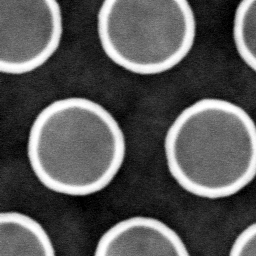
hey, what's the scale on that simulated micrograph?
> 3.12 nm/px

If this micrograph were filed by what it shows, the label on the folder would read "raised bodies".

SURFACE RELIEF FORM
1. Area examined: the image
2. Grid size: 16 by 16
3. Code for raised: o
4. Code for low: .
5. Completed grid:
ooo....ooooo...o
oooo..oooooo...o
ooo...oooooo...o
ooo....oooo....o
................
................
....oo.......o..
..ooooo....oooo.
..ooooo....ooooo
..oooooo...ooooo
..ooooo....ooooo
...ooo......ooo.
................
................
ooo....oooo.....
ooo...ooooo....o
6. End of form